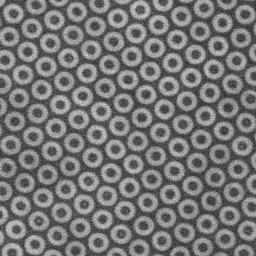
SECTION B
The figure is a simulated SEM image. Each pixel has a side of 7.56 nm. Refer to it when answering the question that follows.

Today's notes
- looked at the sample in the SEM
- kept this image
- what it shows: a regular array of ring-shaped raised bodies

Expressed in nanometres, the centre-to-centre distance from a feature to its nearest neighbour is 176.